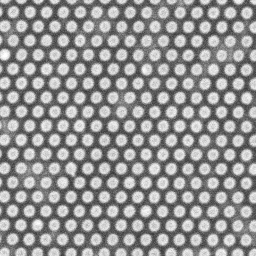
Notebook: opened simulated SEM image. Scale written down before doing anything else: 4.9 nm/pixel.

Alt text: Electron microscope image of a regular array of raised bodies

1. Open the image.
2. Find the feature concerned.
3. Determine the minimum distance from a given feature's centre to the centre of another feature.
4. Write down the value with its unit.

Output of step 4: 79.5 nm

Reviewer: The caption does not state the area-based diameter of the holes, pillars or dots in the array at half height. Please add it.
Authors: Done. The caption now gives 49.7 nm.